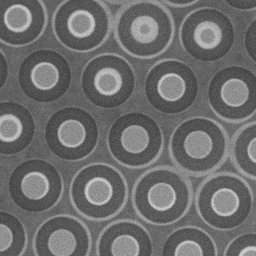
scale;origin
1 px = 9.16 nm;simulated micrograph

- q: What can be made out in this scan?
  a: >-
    an array of small figures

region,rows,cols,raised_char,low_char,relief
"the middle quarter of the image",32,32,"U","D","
DUUUUUDDDDDDDDDDDUUUUUUDDDDDDDDU
DDUUUDDDDDDDDDDDDUUUUUDDDDDDDDDD
DDUUUDDDDUUUUDDDDUUUUDDDDDDDDDDD
DDUUDDDDUUUUUDDDDDUUDDDDDUUUUDDD
DDUUDDDDUUUUUUDDDDUUDDDDUUUUUUDD
DUUUDDDDUUUUUUDDDDUUDDDDUUUUUUDD
DUUUUDDDDUUUUDDDDUUUDDDDUUUUUUDD
UUUUUDDDDDDDDDDDDUUUDDDDUUUUUDDD
UUUUUUDDDDDDDDDDUUUUUDDDDUUUUDDD
UUUUUUUDDDDDDDDUUUUUUDDDDDDDDDDD
UUUUUUUUDDDDDDUUUUUUUUDDDDDDDDDD
DDDDDUUUUUUUUUUUUUUUUUUDDDDDDDUU
DDDDDDUUUUUUUUUUDDDDUUUUUUUUUUUU
DDDDDDDUUUUUUUDDDDDDDDUUUUUUUUUU
DUUDDDDDUUUUUDDDDDDDDDDUUUUUUUDD
UUUUUDDDUUUUDDDDDDDDDDDDUUUUUDDD
UUUUUDDDUUUDDDDUUUUUDDDDUUUUDDDD
UUUUUDDDDUUDDDDUUUUUUDDDUUUDDDDU
UUUUUDDDDUUDDDDUUUUUUDDDDUUDDDDU
UUUUDDDDUUUDDDUUUUUUUDDDDUUDDDUU
DDUDDDDDUUUDDDDUUUUUUDDDUUDDDDUU
DDDDDDDUUUUDDDDDUUUUDDDDUUUDDDUU
DDDDDDUUUUUUDDDDDDDDDDDDUUUDDDDU
DDDDDUUUUUUUUDDDDDDDDDDUUUUDDDDD
UUUUUUUUUUUUUUDDDDDDDDUUUUUUDDDD
UUUUUUDDDDDUUUUUDDDDUUUUUUUUUDDD
UUUUDDDDDDDDDUUUUUUUUUDDDDDUUUDD
UUUDDDDDDDDDDDUUUUUUDDDDDDDDDUUU
UUUDDDDDDDDDDDDUUUUDDDDDDDDDDDUU
UUDDDDDUUUUDDDDUUUDDDDDDDDDDDDDU
UUDDDDUUUUUDDDDUUUDDDDUUUUDDDDDU
UUDDDDUUUUUUDDDDUUDDDDUUUUUDDDDD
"